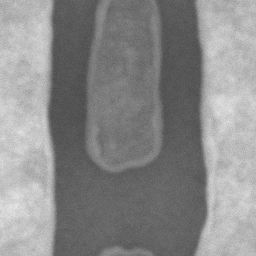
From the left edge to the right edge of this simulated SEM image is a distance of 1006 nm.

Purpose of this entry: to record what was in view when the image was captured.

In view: one or a few lines or trenches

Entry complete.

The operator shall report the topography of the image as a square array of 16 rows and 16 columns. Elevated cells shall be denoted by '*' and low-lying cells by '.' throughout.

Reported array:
***...****...***
***...****...***
***...****...***
***...****...***
***...****...***
***...****...***
***...****...***
***...****...***
***...****...***
***...****...***
***....*.....***
***..........***
***..........***
***..........***
***..........***
***..........***